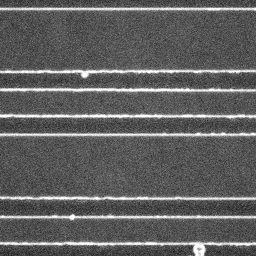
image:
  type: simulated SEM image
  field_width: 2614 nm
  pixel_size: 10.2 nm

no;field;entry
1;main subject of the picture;lines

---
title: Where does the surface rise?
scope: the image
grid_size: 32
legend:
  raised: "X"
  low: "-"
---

--------------------------------
XXXXXXXXXXXXXXXXXXXXXXXXXXXXXXXX
XXXXXXXXXXXXXXXXXXXXXXXXXXXXXXXX
XXXXXXXXXXXXXXXXXXXXXXXXXXXXXXXX
XXXXXXXXXXXXXXXXXXXXXXXXXXXXXXXX
XXXXXXXXXXXXXXXXXXXXXXXXXXXXXXXX
XXXXXXXXXXXXXXXXXXXXXXXXXXXXXXXX
XXXXXXXXXXXXXXXXXXXXXXXXXXXXXXXX
XXXXXXXXXXXXXXXXXXXXXXXXXXXXXXXX
--------------------------------
--------------------------------
XXXXXXXXXXXXXXXXXXXXXXXXXXXXXXXX
XXXXXXXXXXXXXXXXXXXXXXXXXXXXXXXX
XXXXXXXXXXXXXXXXXXXXXXXXXXXXXXXX
XXXXXXXXXXXXXXXXXXXXXXXXXXXXXXXX
--------------------------------
--------------------------------
XXXXXXXXXXXXXXXXXXXXXXXXXXXXXXXX
XXXXXXXXXXXXXXXXXXXXXXXXXXXXXXXX
XXXXXXXXXXXXXXXXXXXXXXXXXXXXXXXX
XXXXXXXXXXXXXXXXXXXXXXXXXXXXXXXX
XXXXXXXXXXXXXXXXXXXXXXXXXXXXXXXX
XXXXXXXXXXXXXXXXXXXXXXXXXXXXXXXX
XXXXXXXXXXXXXXXXXXXXXXXXXXXXXXXX
XXXXXXXXXXXXXXXXXXXXXXXXXXXXXXXX
--------------------------------
--------------------------------
XXXXXXXXXXXXXXXXXXXXXXXXXXXXXXXX
XXXXXXXXXXXXXXXXXXXXXXXXXXXXXXXX
XXXXXXXXXXXXXXXXXXXXXXXXXXXXXXXX
-------X----XX------X---XX-X-XXX
------------------------X-------